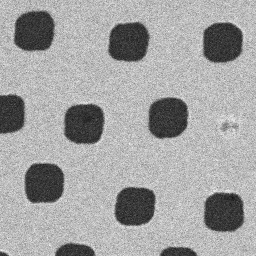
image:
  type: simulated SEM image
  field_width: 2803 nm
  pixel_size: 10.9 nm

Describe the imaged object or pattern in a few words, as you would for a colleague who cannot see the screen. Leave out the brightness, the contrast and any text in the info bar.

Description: a regular array of holes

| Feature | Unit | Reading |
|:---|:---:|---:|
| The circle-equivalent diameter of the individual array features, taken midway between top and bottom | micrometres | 0.459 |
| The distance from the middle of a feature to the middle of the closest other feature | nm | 958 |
